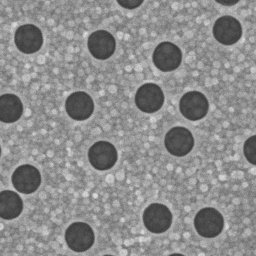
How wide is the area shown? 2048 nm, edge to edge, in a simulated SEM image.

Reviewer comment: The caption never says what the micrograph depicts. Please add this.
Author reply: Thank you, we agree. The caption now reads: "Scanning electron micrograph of a regular array of holes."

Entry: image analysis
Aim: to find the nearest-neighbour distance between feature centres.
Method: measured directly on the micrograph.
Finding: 438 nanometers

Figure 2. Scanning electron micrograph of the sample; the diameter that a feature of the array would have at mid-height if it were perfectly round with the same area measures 240 nanometers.